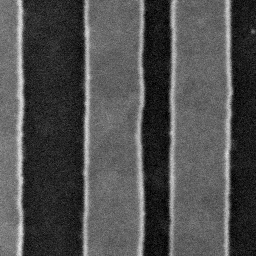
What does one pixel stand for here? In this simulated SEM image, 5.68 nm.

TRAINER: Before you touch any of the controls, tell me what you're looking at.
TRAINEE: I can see lines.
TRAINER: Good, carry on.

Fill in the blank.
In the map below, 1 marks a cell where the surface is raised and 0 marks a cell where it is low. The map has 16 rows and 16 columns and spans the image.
1000011110011100
1000011110011100
1000011110011100
1000011110011100
1000011110011100
1000011110011100
1000011110011100
1000011110011100
1000011110011100
1000011110011100
1000011110011100
1000011110011100
1000011110011100
1000011110011100
1000011110011100
1000011110011100